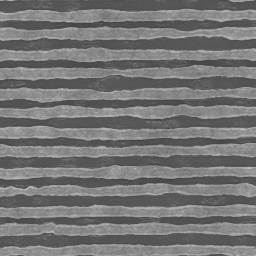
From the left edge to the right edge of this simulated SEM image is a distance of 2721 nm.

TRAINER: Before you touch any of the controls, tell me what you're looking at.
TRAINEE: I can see parallel lines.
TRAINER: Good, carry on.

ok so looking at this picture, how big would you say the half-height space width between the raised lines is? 10.4 px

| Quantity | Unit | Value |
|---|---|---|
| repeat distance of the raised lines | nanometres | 207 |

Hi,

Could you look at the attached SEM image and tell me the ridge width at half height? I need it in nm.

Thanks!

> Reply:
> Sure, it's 102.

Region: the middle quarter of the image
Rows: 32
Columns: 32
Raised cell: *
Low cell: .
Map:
................................
***********.*....***************
********************************
***...................**.....***
................................
................................
*.................**************
********************************
*****************.**************
................................
............................***.
************.*******************
********************************
.....................****.......
................................
................................
*************......**..*********
********************************
...*****.*************..........
................................
.......................**.......
********************************
********************************
................................
................................
............**......****........
********************************
********************************
..........********..............
................................
**...........*.*************...*
********************************